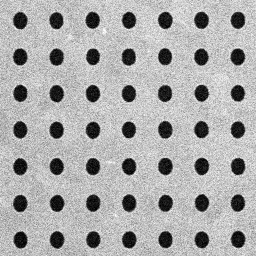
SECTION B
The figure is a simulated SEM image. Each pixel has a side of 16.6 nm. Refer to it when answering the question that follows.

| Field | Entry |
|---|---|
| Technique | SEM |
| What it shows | a regular array of holes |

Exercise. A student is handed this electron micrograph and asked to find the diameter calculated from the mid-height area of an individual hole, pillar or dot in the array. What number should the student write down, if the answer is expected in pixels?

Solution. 16.2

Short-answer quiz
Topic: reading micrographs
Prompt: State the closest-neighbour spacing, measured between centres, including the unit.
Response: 0.6 um